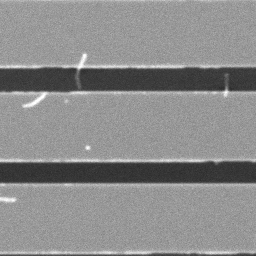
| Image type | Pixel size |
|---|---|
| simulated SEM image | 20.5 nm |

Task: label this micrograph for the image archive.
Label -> lines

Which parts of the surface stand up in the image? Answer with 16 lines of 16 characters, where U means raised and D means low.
UUUUUUUUUUUUUUUU
UUUUUUUUUUUUUUUU
UUUUUUUUUUUUUUUU
UUUUUUUUUUUUUUUU
DDDDDDDDDDDDDDDD
DDDDDDDDDDDDDDDD
UUUUUUUUUUUUUUUU
UUUUUUUUUUUUUUUU
UUUUUUUUUUUUUUUU
UUUUUUUUUUUUUUUU
DDDDDDDDDDDDDDDD
DDDDDDDDDDDDDDDD
UUUUUUUUUUUUUUUU
UUUUUUUUUUUUUUUU
UUUUUUUUUUUUUUUU
UUUUUUUUUUUUUUUU